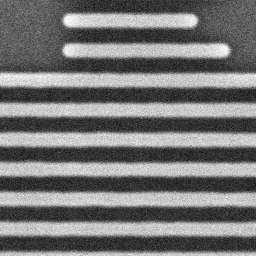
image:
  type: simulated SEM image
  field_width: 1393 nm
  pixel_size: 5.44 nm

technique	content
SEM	groups of lines, slits or small figures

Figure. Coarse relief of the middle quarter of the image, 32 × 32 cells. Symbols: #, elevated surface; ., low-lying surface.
................................
................................
...###..........................
################################
################################
.........................#######
................................
................................
................................
................................
################################
################################
################################
................................
................................
................................
................................
#####.##############....########
################################
################################
................................
................................
................................
................................
................................
################################
################################
################################
................................
................................
................................
................................